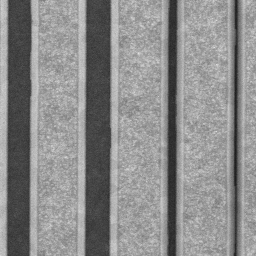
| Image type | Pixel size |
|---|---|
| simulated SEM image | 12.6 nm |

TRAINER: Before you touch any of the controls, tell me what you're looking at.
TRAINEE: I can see one or a few lines or trenches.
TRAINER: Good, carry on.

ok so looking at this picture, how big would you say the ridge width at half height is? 625 nm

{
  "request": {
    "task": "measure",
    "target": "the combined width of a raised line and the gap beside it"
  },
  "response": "927 nanometres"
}